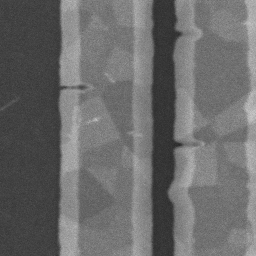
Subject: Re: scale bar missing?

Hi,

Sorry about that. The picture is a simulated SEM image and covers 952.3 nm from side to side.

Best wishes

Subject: one or a few lines or trenches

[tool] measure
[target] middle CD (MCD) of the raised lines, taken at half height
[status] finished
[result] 70.7 pixels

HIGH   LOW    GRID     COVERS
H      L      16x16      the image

LLLLHHHHHLLLHHHH
LLLLHHHHHLLLHHHH
LLLLLHHHHLLLHHHH
LLLLHHHHHLLLHHHH
LLLLHHHHHLLLHHHH
LLLLLHHHHLLLHHHH
LLLLHHHHHLLLHHHH
LLLLHHHHHLLLHHHH
LLLLHHHHHLLLHHHH
LLLLHHHHHLLLHHHH
LLLLHHHHHLLLHHHH
LLLLHHHHHLLHHHHH
LLLLHHHHHLLHHHHH
LLLLHHHHHLLLHHHH
LLLLHHHHHLLLHHHH
LLLLHHHHHLLLHHHH